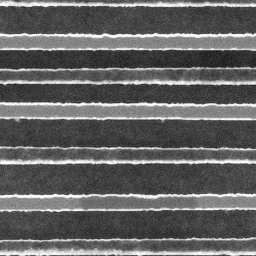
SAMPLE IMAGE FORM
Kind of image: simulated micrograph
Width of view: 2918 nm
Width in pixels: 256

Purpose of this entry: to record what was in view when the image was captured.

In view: lines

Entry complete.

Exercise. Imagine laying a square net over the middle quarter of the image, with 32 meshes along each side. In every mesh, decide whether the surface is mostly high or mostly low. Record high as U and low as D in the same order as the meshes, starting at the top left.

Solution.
DDDDDDDDDDDDDDDDDDDDDDDDDDDDDDDD
UUUUUUUUUUUUUUUUUUUUUUUUUUUUUUUU
UUUUUUUUUUUUUUUUUUUUUUUUUUUUUUUU
UUUUUUUUUUUUUUUUUUUUUUUUUUUUUUUU
UUUUUUUUUUUUUUUUUUUUUUUUUUUUUUUU
DDDDDDDDDDDDDDDDDDDDDDDDDDDDDDDD
DDDDDDDDDDDDDDDDDDDDDDDDDDDDDDDD
DDDDDDDDDDDDDDDDDDDDDDDDDDDDDDDD
DDDDDDDDDDDDDDDDDDDDDDDDDDDDDDDD
DDDDDDDDDDDDDDDDDDDDDDDDDDDDDDDD
UUUUUUUUUUUUUUUUUUUUUUUUUUUUUUUU
UUUUUUUUUUUUUUUUUUUUUUUUUUUUUUUU
UUUUUUUUUUUUUUUUUUUUUUUUUUUUUUUU
UUUUUUUUUUUUUUUUUUUUUUUUUUUUUUUU
DDDDDDDDDDDDDDDDDDDDDDDDDDDDDDDD
DDDDDDDDDDDDDDDDDDDDDDDDDDDDDDDD
DDDDDDDDDDDDDDDDDDDDDDDDDDDDDDDD
DDDDDDDDDDDDDDDDDDDDDDDDDDDDDDDD
DDDDDDDDDDDDDDDDDDDDDDDDDDDDDDDD
DDDDDDDDDDDDDDDDDDDDDDDDDDDDDDDD
DDDDDDDDDDDDDDDDDDDDDDDDDDDDDDDD
UUUUUUUUUUUUUUUUUUUUUUUUUUUUUUUU
UUUUUUUUUUUUUUUUUUUUUUUUUUUUUUUU
UUUUUUUUUUUUUUUUUUUUUUUUUUUUUUUU
UDDDDDDUUDDUUUUDUUUUDUDDUUDUUDDU
DDDDDDDDDDDDDDDDDDDDDDDDDDDDDDDD
DDDDDDDDDDDDDDDDDDDDDDDDDDDDDDDD
DDDDDDDDDDDDDDDDDDDDDDDDDDDDDDDD
DDDDDDDDDDDDDDDDDDDDDDDDDDDDDDDD
DDDDDDDDDDDDDDDDDDDDDDDDDDDDDDDD
DDDDDDDDDDDDDDDDDDDDDDDDDDDDDDDD
DDDDDDDDDDDDDDDDDDDDDDDDDDDDDDDD